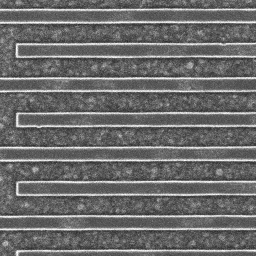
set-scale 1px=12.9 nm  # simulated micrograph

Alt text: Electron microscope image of parallel lines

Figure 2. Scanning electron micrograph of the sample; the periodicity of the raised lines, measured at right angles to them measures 446 nm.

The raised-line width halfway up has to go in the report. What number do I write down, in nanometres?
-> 170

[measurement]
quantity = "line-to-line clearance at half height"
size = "278 nm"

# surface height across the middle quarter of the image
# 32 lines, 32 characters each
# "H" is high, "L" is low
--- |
LLLLLLLLLLLLLLLLLLLLLLLLLLLLLLLL
LLLLLLLLLLLLLLLLLLLLLLLLLLLLLLLL
LLLLLLLLLLLLLLLLLLLLLLLLLLLLLLLL
LLLLLLLLLLLLLLLLLLLLLLLLLLLLLLLL
HHHHHHHHHHHHHHHHHHHHHHHHHHHHHHHH
HHHHHHHHHHHHHHHHHHHHHHHHHHHHHHHH
HHHHHHHHHHHHHHHHHHHHHHHHHHHHHHHH
LLLLLLLLLLLLLLLLLLLLLLLLLLLLLLLL
LLLLLLLLLLLLLLLLLLLLLLLLLLLLLLLL
LLLLLLLLLLLLLLLLLLLLLLLLLLLLLLLL
LLLLLLLLLLLLLLLLLLLLLLLLLLLLLLLL
LLLLLLLLLLLLLLLLLLLLLLLLLLLLLLLL
HHHHHHHHHHHHHHHHHHLHHHHHHHHHHHHH
HHHHHHHHHHHHHHHHHHHHHHHHHHHHHHHH
HHHHHHHHHHHHHHHHHHHHHHHHHHHHHHHH
HHHHHLLLLLLLLLLLLLLLLLLLLLLLLLLL
LLLLLLLLLLLLLLLLLLLLLLLLLLLLLLLL
LLLLLLLLLLLLLLLLLLLLLLLLLLLLLLLL
LLLLLLLLLLLLLLLLLLLLLLLLLLLLLLLL
LLLLLLLLLLLLLLLLLLLLLLLLLLLLLLLL
LLLLLLLLLLLLLLLLLLLLLLLLLLLLLLLL
HHHHHHHHHHHHHHHHHHHHHHHHHHHHHHHH
HHHHHHHHHHHHHHHHHHHHHHHHHHHHHHHH
HHHHHHHHHHHHHHHHHHHHHHHHHHHHHHHH
LLLLLLLLLLLLLLLLLLLLLLLLLLLLLLLL
LLLLLLLLLLLLLLLLLLLLLLLLLLLLLLLL
LLLLLLLLLLLLLLLLLLLLLLLLLLLLLLLL
LLLLLLLLLLLLLLLLLLLLLLLLLLLLLLLL
LLLLLLLLLLLLLLLLLLLLLLLLLLLLLLLL
LLLLLLLLLHLLLLLLLLLLLLLLLHHHHHLL
HHHHHHHHHHHHHHHHHHHHHHHHHHHHHHHH
HHHHHHHHHHHHHHHHHHHHHHHHHHHHHHHH